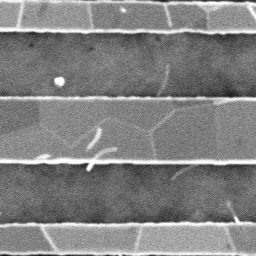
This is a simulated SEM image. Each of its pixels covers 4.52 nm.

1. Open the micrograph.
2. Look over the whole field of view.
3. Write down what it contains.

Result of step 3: lines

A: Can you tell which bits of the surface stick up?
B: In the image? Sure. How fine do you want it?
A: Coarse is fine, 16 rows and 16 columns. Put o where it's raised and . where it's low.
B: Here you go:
oooooooooooooooo
oooooooooooooooo
................
................
................
................
oooooooooooooooo
oooooooooooooooo
oooooooooooooooo
oooooooooooooooo
................
................
................
................
oooooooooooooooo
oooooooooooooooo